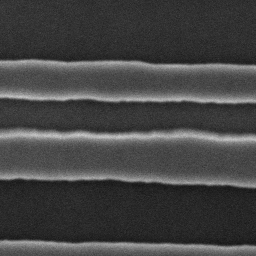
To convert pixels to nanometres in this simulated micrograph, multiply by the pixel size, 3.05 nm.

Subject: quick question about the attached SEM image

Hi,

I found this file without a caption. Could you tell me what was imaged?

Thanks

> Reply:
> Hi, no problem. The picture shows lines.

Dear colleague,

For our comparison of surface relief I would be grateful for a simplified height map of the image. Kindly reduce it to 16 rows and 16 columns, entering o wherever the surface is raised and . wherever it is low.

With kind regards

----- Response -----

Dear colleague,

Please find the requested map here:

................
................
................
................
oooooooooooooooo
oooooooooooooooo
oooooooooooooooo
oooooooooooooooo
oooooooooooooooo
oooooooooooooooo
oooooooooooooooo
.............ooo
................
................
................
oooooooooooooooo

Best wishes